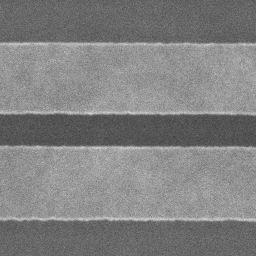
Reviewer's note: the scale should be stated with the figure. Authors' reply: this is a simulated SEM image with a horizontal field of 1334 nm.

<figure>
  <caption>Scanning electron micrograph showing lines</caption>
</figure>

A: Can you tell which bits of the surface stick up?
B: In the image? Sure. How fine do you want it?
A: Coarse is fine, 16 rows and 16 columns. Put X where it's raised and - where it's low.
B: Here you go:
----------------
----------------
----------------
XXXXXXXXXXXXXXXX
XXXXXXXXXXXXXXXX
XXXXXXXXXXXXXXXX
XXXXXXXXXXXXXXXX
----------------
----------------
XXXXXXXXXXXXXXXX
XXXXXXXXXXXXXXXX
XXXXXXXXXXXXXXXX
XXXXXXXXXXXXXXXX
XXXXXXXXXXXXXXXX
----------------
----------------